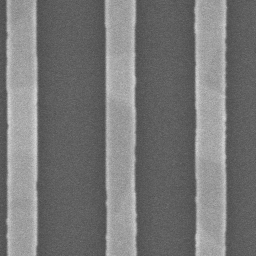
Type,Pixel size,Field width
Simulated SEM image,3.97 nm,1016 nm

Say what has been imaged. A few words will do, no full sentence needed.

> lines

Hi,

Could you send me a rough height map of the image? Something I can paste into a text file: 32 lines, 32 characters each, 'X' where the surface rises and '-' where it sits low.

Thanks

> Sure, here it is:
-XXX---------XXXX-------XXXX----
-XXX---------XXXX-------XXXX----
-XXX---------XXXX-------XXXX----
-XXX---------XXXX-------XXXX----
-XXX---------XXXX-------XXXX----
-XXX---------XXXX-------XXXX----
-XXX---------XXXX-------XXXX----
-XXXX--------XXXX-------XXXX----
-XXXX--------XXXX-------XXXX----
-XXXX--------XXXX-------XXXX----
-XXXX--------XXXX-------XXXX----
-XXXX--------XXXX-------XXXX----
-XXXX--------XXXX-------XXXX----
-XXXX--------XXXX-------XXXX----
-XXXX--------XXXX--------XXX----
-XXXX--------XXXX--------XXX----
-XXXX--------XXXX-------XXXX----
-XXXX--------XXXX-------XXXX----
-XXXX--------XXXX-------XXXX----
-XXXX--------XXXX-------XXXX----
-XXXX--------XXXX-------XXXX----
-XXXX--------XXXX-------XXXX----
-XXXX--------XXXX-------XXXX----
-XXX---------XXXX--------XXX----
-XXXX--------XXXX-------XXXX----
-XXXX--------XXXX-------XXXX----
-XXXX--------XXXX--------XXX----
-XXXX--------XXXX--------XXX----
-XXXX--------XXXX--------XXX----
-XXXX--------XXXX-------XXXX----
-XXXX--------XXXX-------XXXX----
-XXX---------XXXX-------XXXX----